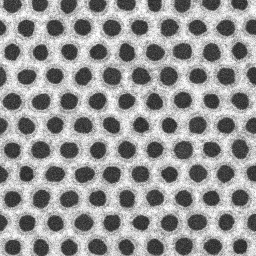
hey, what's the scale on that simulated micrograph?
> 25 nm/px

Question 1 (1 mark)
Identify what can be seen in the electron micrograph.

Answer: a regular array of holes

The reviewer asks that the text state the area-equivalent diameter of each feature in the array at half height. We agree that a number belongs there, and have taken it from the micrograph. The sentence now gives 435 nm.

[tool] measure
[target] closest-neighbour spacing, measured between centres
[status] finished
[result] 0.69 um